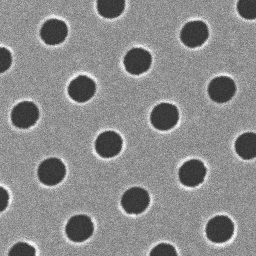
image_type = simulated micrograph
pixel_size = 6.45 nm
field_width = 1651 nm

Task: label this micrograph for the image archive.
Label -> a regular array of holes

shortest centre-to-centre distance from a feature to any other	402	nanometres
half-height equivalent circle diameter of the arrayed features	183	nanometres